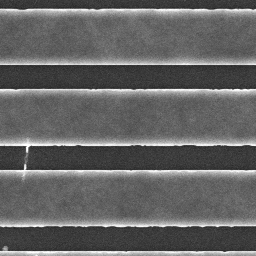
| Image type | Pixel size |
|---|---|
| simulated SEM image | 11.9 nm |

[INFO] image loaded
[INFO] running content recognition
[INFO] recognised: lines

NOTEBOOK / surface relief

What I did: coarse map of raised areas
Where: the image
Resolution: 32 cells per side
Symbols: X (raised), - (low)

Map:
--------------------------------
XXXXXXXXXXXXXXXXXXXXXXXXXXXXXXXX
XXXXXXXXXXXXXXXXXXXXXXXXXXXXXXXX
XXXXXXXXXXXXXXXXXXXXXXXXXXXXXXXX
XXXXXXXXXXXXXXXXXXXXXXXXXXXXXXXX
XXXXXXXXXXXXXXXXXXXXXXXXXXXXXXXX
XXXXXXXXXXXXXXXXXXXXXXXXXXXXXXXX
XXXXXXXXXXXXXXXXXXXXXXXXXXXXXXXX
--------------------------------
--------------------------------
--------------------------------
XXXXXXXXXXXXXXXXXXXXXXXXXXXXXXXX
XXXXXXXXXXXXXXXXXXXXXXXXXXXXXXXX
XXXXXXXXXXXXXXXXXXXXXXXXXXXXXXXX
XXXXXXXXXXXXXXXXXXXXXXXXXXXXXXXX
XXXXXXXXXXXXXXXXXXXXXXXXXXXXXXXX
XXXXXXXXXXXXXXXXXXXXXXXXXXXXXXXX
XXXXXXXXXXXXXXXXXXXXXXXXXXXXXXXX
--------------------------------
--------------------------------
--------------------------------
XXXXXXXXXXXXXXXXXXXXXXXXXXXXXXXX
XXXXXXXXXXXXXXXXXXXXXXXXXXXXXXXX
XXXXXXXXXXXXXXXXXXXXXXXXXXXXXXXX
XXXXXXXXXXXXXXXXXXXXXXXXXXXXXXXX
XXXXXXXXXXXXXXXXXXXXXXXXXXXXXXXX
XXXXXXXXXXXXXXXXXXXXXXXXXXXXXXXX
XXXXXXXXXXXXXXXXXXXXXXXXXXXXXXXX
--------------------------------
--------------------------------
--------------------------------
XXXXXXXXXXXXXXXXXXXXXXXXXXXXXXXX